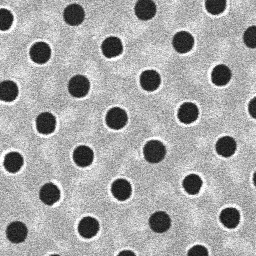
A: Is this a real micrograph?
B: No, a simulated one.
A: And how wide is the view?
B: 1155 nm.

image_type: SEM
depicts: a regular array of holes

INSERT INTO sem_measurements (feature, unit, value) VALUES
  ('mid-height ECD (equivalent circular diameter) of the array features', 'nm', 96.4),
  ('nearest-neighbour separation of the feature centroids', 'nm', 226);